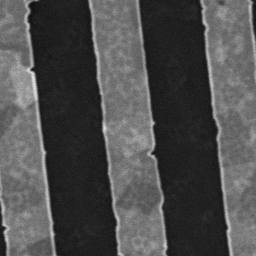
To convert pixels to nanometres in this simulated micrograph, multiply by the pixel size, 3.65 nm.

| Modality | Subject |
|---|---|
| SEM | one or a few lines or trenches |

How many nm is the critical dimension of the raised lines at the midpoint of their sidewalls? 174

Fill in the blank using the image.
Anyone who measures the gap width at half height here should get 0.232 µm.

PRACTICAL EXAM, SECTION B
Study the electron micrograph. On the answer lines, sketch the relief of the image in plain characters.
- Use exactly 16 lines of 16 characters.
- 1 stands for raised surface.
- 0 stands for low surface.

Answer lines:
1100001110000111
1100001110000111
1100001110000111
1100001110000111
1100001110000111
1100001110000111
1100001110000111
1100001110000111
1110000111000011
1110000111000011
1110000111000011
1110000111000011
1110000111000011
1110000111000011
1110000111000011
1110000111000011